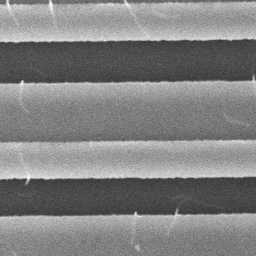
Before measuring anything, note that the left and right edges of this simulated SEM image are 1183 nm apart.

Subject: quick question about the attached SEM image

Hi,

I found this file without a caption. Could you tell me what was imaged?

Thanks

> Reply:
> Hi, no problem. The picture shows lines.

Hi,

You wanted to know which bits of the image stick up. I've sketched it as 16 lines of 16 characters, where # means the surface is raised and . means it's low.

################
################
#############.#.
................
................
################
################
################
################
################
################
................
................
......##########
################
################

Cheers